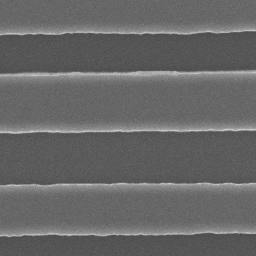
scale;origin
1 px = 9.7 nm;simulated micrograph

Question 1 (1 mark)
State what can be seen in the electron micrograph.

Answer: lines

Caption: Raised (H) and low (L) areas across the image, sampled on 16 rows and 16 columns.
HHHHHHHHHHHHHHHH
HHHHHHHHHHHHHHHH
LLLLLLLLLLLLLLLL
LLLLLLLLLLLLLLLL
LLLLLLLLHHHLLLLL
HHHHHHHHHHHHHHHH
HHHHHHHHHHHHHHHH
HHHHHHHHHHHHHHHH
LLLLLLLLLLLLLLLL
LLLLLLLLLLLLLLLL
LLLLLLLLLLLLLLLL
LLLLLLLHLLLLHLLH
HHHHHHHHHHHHHHHH
HHHHHHHHHHHHHHHH
HHHHHHHHHHHHHHHH
LLLLLLLLLLLLLLLL